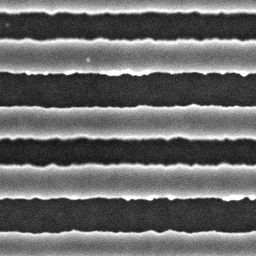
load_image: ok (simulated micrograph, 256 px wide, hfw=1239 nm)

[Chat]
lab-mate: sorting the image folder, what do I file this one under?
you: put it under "lines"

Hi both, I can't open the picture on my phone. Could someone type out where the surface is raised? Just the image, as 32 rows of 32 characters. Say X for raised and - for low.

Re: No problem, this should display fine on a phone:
XXXXXXXXXXXXXXXXXXXXXXXXXXXXXXXX
------X----X--------------------
--------------------------------
--------------------------------
--------------------------------
XXXXXXXXXXXXXXXXXXXXXXXXXXXXXXXX
XXXXXXXXXXXXXXXXXXXXXXXXXXXXXXXX
XXXXXXXXXXXXXXXXXXXXXXXXXXXXXXXX
XXXXXXXXXXXXXXXXXXXXXXXXXXXXXXXX
--------------------------------
--------------------------------
--------------------------------
--------------------------------
XXXXX------XXX---XX-XXXXXXXXXXXX
XXXXXXXXXXXXXXXXXXXXXXXXXXXXXXXX
XXXXXXXXXXXXXXXXXXXXXXXXXXXXXXXX
XXXXXXXXXXXXXXXXXXXXXXXXXXXXXXXX
--------------------------------
--------------------------------
--------------------------------
--------------------------------
XXXXXXXXXXXXXXXXXXXXXXXXXXXXXXXX
XXXXXXXXXXXXXXXXXXXXXXXXXXXXXXXX
XXXXXXXXXXXXXXXXXXXXXXXXXXXXXXXX
XXXXXXXXXXXXXXXXXXXXXXXXXXXXXXXX
--------------------------------
--------------------------------
--------------------------------
--------------------------------
XXXXXXXXXXXXXXXXXXXXXXXXXXXXXXXX
XXXXXXXXXXXXXXXXXXXXXXXXXXXXXXXX
XXXXXXXXXXXXXXXXXXXXXXXXXXXXXXXX